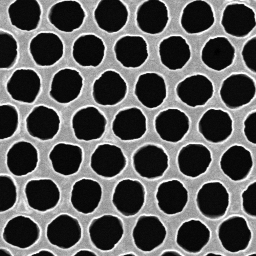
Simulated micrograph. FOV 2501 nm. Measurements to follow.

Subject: a regular array of holes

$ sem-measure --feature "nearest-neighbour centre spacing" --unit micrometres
0.402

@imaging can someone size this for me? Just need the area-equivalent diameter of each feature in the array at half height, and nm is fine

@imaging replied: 323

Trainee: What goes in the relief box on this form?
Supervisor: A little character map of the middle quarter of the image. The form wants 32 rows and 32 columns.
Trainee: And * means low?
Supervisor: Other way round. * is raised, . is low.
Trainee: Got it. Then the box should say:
*****.*.*******....******.....**
..*************************.****
....******....******...*********
....*****......****.....******..
.....***.......***.......****...
.....**.........**.......****...
....***........***.......***....
....***........***........**....
...*****.......***.......****...
.*******.....******......*****..
********************....********
****.....*******...*******...***
***......****.......****......**
**........***.......***........*
**........**.........**........*
**........**.........**........*
***.......**.........**........*
***.......***.......****......**
***......*****.....*****.....***
***************************.****
...******....********..*******..
....****......*****......****...
.....**........***........***...
....***........**.........***...
....***.........*.........***...
....***........***........***...
....***........***........***...
..******.....******......*****..
*********************.**********
***.....******.....*******...***
**.......****......*****......**
**.......****.......***........*